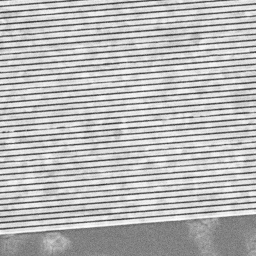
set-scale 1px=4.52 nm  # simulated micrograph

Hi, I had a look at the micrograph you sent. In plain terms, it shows parallel lines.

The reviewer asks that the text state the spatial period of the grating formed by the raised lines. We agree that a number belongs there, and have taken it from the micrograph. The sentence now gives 6 pixels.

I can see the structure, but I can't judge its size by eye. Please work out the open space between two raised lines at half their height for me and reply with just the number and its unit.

8.5 nm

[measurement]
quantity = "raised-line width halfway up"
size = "3.61 pixels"